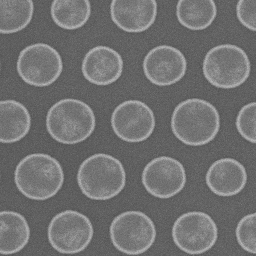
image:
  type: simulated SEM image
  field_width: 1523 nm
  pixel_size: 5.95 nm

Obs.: a regular array of raised bodies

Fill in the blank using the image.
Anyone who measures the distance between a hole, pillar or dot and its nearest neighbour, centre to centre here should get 371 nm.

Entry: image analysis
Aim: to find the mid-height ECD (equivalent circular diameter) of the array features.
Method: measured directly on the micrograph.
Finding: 252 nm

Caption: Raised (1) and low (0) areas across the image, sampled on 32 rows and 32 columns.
11110001111000111110001111100011
11110011111000111110001111100011
11110001111000111110001111100011
11100000000000011100000010000001
00000000000000000000000000000000
00000000000000000000000000000000
00011110000111000001110000111100
00111111000111100011111000111110
00111111001111100011111000111110
00011110000111100011111000111110
00001100000000000000100000011100
00000000000000000000000000000000
00000000100000000000000010000000
11100001111000011110001111100001
11110011111100111110001111100011
11110011111100111110001111100011
11100011111000111110001111100011
11000001110000001100000111000001
00000000000000000000000000000000
00001100000011000000000000000000
00111110001111100001110000011100
00111111001111100011111000111110
00111111001111110011111000111110
00111110001111100011111000111100
00011100000111000000100000000000
00000000000000000000000000000000
10000000000000000000000000000000
11100001111000111110001111000011
11100011111000111110001111100011
11100011111000111110001111100011
11100011111000111110001111100011
11000000110000001100000010000001